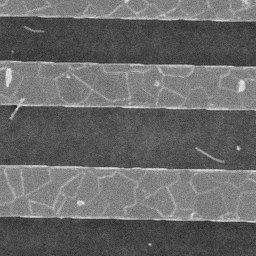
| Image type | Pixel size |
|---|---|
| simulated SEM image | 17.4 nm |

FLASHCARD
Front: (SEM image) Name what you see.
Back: lines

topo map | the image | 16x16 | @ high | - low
@@@@@@@@@@@@@@@@
----------------
----------------
----------------
@@@@@@@@@@@@@@@@
@@@@@@@@@@@@@@@@
@@@@@@@@@@@@@@@@
----------------
----------------
----------------
@@@@@@----------
@@@@@@@@@@@@@@@@
@@@@@@@@@@@@@@@@
-@@@@@@@@@@@@@@@
----------------
----------------